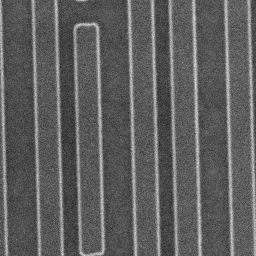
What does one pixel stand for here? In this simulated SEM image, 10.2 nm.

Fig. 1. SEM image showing parallel lines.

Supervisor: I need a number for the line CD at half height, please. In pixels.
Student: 23.1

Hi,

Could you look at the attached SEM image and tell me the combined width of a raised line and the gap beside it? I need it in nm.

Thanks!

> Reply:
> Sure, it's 492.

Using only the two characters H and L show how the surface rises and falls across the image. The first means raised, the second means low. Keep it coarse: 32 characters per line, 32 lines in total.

LLLLHHHLLLLLLLLLHHHLLHHHLLLLHHHL
LLLLHHHLLLLLLLLLHHHLLHHHLLLLHHHL
LLLLHHHLLLLLLLLLHHHLLHHHLLLLHHHL
LLLLHHHLLHHHLLLLHHHLLHHHLLLLHHHL
LLLLHHHLLHHHLLLLHHHLLHHHLLLLHHHL
LLLLHHHLLHHHLLLLHHHLLHHHLLLLHHHL
LLLLHHHLLHHHLLLLHHHLLLHHLLLLHHHL
LLLLHHHLLHHHLLLLHHHLLLHHLLLLHHHL
LLLLHHHLLHHHLLLLHHHLLHHHLLLLHHHL
LLLLHHHLLLHHLLLLHHHLLHHHLLLLLHHL
LLLLHHHLLLHHLLLLHHHLLLHHLLLLLHHL
LLLLHHHLLLHHLLLLLHHLLLHHHLLLLHHL
LLLLHHHLLLHHLLLLLHHLLLHHHLLLLHHL
LLLLLHHLLLHHLLLLLHHLLLHHHLLLLHHL
LLLLLHHLLLHHLLLLLHHLLLHHHLLLLHHH
LLLLLHHLLLHHLLLLLHHLLLHHHLLLLHHH
LLLLLHHLLLHHLLLLLHHLLLHHHLLLLHHL
LLLLLHHLLLHHHLLLLHHLLLHHHLLLLHHL
LLLLLHHLLLHHHLLLLHHLLLHHHLLLLHHH
LLLLLHHLLLHHHLLLLHHLLLHHHLLLLHHH
HLLLLHHLLLHHHLLLLHHHLLHHHLLLLHHH
HLLLLHHLLLHHHLLLLHHHLLHHHLLLLHHH
HLLLLHHHLLHHHLLLLHHHLLHHHLLLLHHH
HLLLLHHHLLHHHLLLLHHHLLHHHLLLLHHH
HLLLLHHHLLHHHLLLLHHHLLHHHLLLLHHH
HLLLLHHHLLHHHLLLLHHHLLHHHLLLLHHH
HLLLLHHHLLHHHLLLLHHHLLHHHLLLLHHH
HLLLLHHHLLHHHLLLLHHHLLHHHLLLLHHH
HLLLLHHHLLHHHLLLLHHHLLHHHLLLLHHH
HLLLLHHHLLHHHLLLLHHHLLHHHLLLLHHH
HLLLLHHHLLHHHLLLLHHHLLHHHLLLLHHH
HLLLLHHHLLHHHLLLLHHHLLHHHLLLLHHH